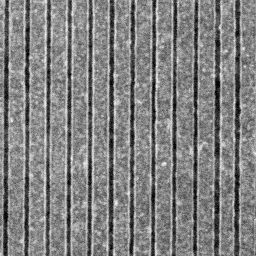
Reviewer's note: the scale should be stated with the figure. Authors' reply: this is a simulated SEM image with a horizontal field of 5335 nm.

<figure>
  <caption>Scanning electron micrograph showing parallel lines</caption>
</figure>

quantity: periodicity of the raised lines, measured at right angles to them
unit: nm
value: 439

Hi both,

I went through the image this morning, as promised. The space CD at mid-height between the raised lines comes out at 109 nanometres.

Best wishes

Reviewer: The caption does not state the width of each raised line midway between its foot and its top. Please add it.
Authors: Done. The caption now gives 328 nm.